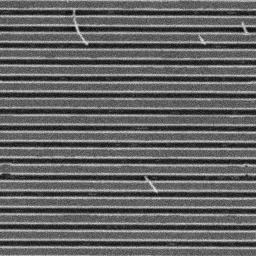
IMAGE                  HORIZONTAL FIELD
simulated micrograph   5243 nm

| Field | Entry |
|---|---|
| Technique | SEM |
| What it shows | parallel lines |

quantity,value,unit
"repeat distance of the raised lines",338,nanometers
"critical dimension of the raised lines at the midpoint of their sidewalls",202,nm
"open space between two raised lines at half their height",6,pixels